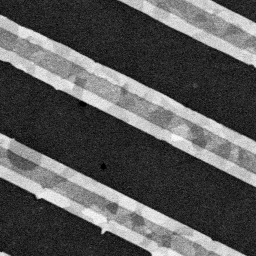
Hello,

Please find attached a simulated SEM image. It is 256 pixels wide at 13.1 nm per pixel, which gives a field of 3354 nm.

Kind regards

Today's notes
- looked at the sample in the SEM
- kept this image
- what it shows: one or a few lines or trenches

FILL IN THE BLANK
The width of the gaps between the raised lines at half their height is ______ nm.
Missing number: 991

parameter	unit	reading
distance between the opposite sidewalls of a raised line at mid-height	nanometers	402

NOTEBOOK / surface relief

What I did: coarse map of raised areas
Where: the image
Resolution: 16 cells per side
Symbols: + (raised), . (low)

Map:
.........++++...
...........++++.
+++..........+++
+++++..........+
..+++++.........
....+++++.......
......+++++.....
........+++++...
..........+++++.
++..........++++
++++..........++
..++++..........
....++++........
......++++......
........++++....
.........+++++..